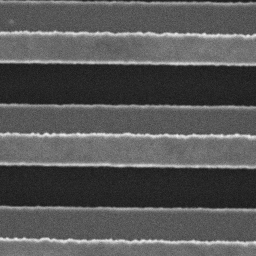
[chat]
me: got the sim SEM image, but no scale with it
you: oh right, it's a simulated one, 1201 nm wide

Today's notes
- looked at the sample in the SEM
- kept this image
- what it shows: lines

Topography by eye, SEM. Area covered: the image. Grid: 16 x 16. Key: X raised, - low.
XXXXXXXXXXXXXXXX
XXXXXXXXXXXXXXXX
XXXXXXXXXXXXXXXX
XXXXXXXXXXXXXXXX
----------------
----------------
----------------
XXXXXXXXXXXXXXXX
XXXXXXXXXXXXXXXX
XXXXXXXXXXXXXXXX
---------------X
----------------
----------------
XXXXXXXXXXXXXXXX
XXXXXXXXXXXXXXXX
XXXXXXXXXXXXXXXX